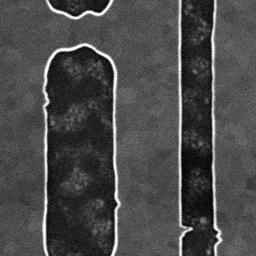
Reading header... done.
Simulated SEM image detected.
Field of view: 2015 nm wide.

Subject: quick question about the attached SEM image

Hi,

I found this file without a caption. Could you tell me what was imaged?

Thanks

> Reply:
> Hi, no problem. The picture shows one or a few lines or trenches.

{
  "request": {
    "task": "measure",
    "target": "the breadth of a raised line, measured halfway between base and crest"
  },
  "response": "0.516 micrometres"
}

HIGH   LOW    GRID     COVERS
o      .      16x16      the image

ooo....oooo..ooo
ooooooooooo..ooo
ooooooooooo..ooo
ooo....oooo..ooo
ooo....oooo..ooo
ooo....oooo..ooo
ooo....oooo..ooo
ooo....oooo..ooo
ooo....oooo..ooo
ooo....oooo..ooo
ooo....oooo..ooo
ooo....oooo..ooo
ooo....oooo..ooo
ooo....oooo..ooo
ooo....ooooo..oo
ooo....oooo...oo